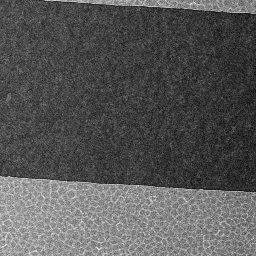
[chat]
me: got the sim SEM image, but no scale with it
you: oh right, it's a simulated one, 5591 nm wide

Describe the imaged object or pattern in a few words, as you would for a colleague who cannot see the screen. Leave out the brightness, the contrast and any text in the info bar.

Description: one or a few lines or trenches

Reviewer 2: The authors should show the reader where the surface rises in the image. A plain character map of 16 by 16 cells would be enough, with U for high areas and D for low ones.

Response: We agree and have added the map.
DDDDDDDDDDDUUUUU
DDDDDDDDDDDDDDDD
DDDDDDDDDDDDDDDD
DDDDDDDDDDDDDDDD
DDDDDDDDDDDDDDDD
DDDDDDDDDDDDDDDD
DDDDDDDDDDDDDDDD
DDDDDDDDDDDDDDDD
DDDDDDDDDDDDDDDD
DDDDDDDDDDDDDDDD
DDDDDDDDDDDDDDDD
UUUUUUDDDDDDDDDD
UUUUUUUUUUUUUUUU
UUUUUUUUUUUUUUUU
UUUUUUUUUUUUUUUU
UUUUUUUUUUUUUUUU